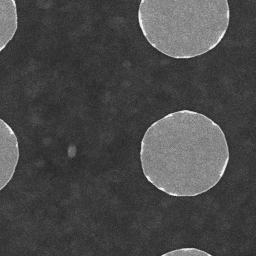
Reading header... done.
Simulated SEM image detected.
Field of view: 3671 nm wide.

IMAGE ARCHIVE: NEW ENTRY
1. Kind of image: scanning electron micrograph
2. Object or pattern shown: raised bodies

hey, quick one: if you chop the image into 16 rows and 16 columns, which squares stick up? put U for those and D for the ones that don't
UDDDDDDDDUUUUUDD
UDDDDDDDDUUUUUDD
UDDDDDDDDUUUUUDD
DDDDDDDDDDUUDDDD
DDDDDDDDDDDDDDDD
DDDDDDDDDDDDDDDD
DDDDDDDDDDDDDDDD
DDDDDDDDDDUUUDDD
UDDDDDDDDUUUUUDD
UDDDDDDDDUUUUUDD
UDDDDDDDDUUUUUDD
DDDDDDDDDDUUUDDD
DDDDDDDDDDDDDDDD
DDDDDDDDDDDDDDDD
DDDDDDDDDDDDDDDD
DDDDDDDDDDDDDDDD